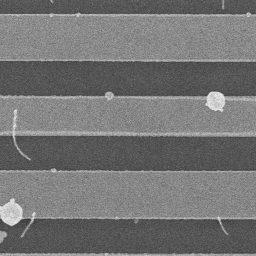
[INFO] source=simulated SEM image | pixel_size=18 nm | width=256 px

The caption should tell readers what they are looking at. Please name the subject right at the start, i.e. lines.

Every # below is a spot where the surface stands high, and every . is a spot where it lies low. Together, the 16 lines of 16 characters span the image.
................
################
################
################
................
................
################
################
................
................
................
################
################
################
................
................